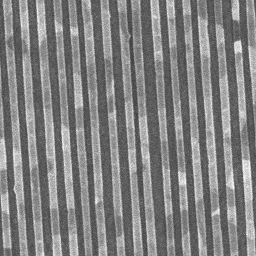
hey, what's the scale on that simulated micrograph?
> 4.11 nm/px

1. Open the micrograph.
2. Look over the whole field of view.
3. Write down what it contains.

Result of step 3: parallel lines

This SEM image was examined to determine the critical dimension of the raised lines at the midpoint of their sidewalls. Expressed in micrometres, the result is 0.0292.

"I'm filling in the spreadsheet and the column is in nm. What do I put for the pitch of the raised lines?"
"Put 66.7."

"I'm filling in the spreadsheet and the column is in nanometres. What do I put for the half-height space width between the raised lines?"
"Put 35.9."